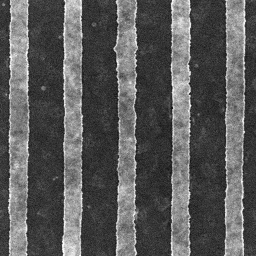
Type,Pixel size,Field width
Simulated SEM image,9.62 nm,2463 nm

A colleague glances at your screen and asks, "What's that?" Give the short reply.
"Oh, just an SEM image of parallel lines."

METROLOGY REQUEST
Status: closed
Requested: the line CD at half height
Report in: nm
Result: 167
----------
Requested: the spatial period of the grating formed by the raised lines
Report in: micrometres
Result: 0.52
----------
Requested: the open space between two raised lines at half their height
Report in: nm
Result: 354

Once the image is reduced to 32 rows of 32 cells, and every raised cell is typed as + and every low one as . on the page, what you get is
.++.....++.....++....+++....+++.
.++.....++.....++.....++....+++.
.++.....++.....++.....++....+++.
.++.....++.....++.....++....+++.
.++.....++.....++.....++....+++.
.+++....++.....++....+++....+++.
.++.....++....+++.....++....++..
.++.....++.....++.....++....++..
.++.....++.....++....+++....+++.
.+++....++.....++.....++....++..
.++.....++.....++.....++....+++.
.++.....++.....++.....++....++..
.+++....++.....++.....++....+++.
.+++....++.....++.....++....+++.
.+++....++.....++.....++....++..
.+++....++.....++.....++....++..
.+++....++.....++.....++....++..
.++.....++.....++.....++....++..
.++.....++.....++.....++....++..
.++.....++.....++.....++....++..
.++.....++.....++.....++....++..
.++.....++.....++.....++....++..
.++.....++.....++....+++....++..
.++.....++.....++.....++....++..
.++.....++.....++.....++....++..
.++.....++.....++.....++....++..
.++.....++.....++....+++....++..
.++.....++.....++....+++....++..
.++.....++.....++....+++....++..
.++.....++.....++....+++....++..
.++.....++.....++....+++....++..
.++.....++.....++....+++....++..